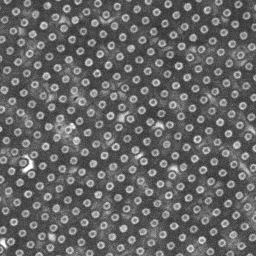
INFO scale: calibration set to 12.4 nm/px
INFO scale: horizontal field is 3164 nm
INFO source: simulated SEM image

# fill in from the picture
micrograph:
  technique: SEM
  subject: a regular array of raised bodies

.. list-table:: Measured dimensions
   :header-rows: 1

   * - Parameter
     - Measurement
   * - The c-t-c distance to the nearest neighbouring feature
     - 13.9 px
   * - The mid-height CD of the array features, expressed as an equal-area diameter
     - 81.3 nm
